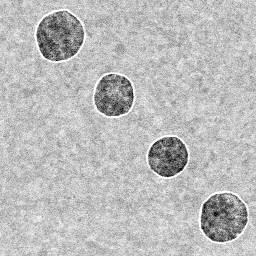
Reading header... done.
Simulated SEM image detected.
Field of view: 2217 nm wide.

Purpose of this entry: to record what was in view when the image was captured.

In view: holes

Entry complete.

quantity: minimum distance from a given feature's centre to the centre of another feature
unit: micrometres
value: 0.701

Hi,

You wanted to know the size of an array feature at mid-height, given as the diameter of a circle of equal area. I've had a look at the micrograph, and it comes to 0.401 microns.